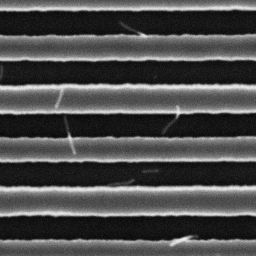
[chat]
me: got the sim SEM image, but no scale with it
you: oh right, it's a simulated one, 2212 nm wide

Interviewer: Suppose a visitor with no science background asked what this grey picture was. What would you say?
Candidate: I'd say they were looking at lines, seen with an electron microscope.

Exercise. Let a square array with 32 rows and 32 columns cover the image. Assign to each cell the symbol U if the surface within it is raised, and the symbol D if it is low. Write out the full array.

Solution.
UUUUUUUUUUUUUUUUUUUUUUUUUUUUUUUU
DDDDDDDDDDDDDDDDDDDDDDDDDDDDDDDD
DDDDDDDDDDDDDDDDDDDDDDDDDDDDDDDD
DDDDDDDDDDDDDDDDDDDDDDDDDDDDDDDD
UDDDDDUDDUUUDUUUUUUUDUUUUUUUUUUU
UUUUUUUUUUUUUUUUUUUUUUUUUUUUUUUU
UUUUUUUUUUUUUUUUUUUUUUUUUUUUUUUU
UUUUUUUUUUUUUUUUUUDUUUUUUUDDUUDU
DDDDDDDDDDDDDDDDDDDDDDDDDDDDDDDD
DDDDDDDDDDDDDDDDDDDDDDDDDDDDDDDD
DDDDDDDDDDDDDDDDDDDDDDDDDDDDDDDD
UUUUUUUUUUUUUUUUUUUUUUUUUUUUUUUU
UUUUUUUUUUUUUUUUUUUUUUUUUUUUUUUU
UUUUUUUUUUUUUUUUUUUUUUUUUUUUUUUU
DDDDDDDDDDDDDDDDDDDDDDDDDDDDDDDD
DDDDDDDDDDDDDDDDDDDDDDDDDDDDDDDD
DDDDDDDDDDDDDDDDDDDDDDDDDDDDDDDD
UUUUUUUUUUUUUUUUUUUUUUUUUUUUUUUU
UUUUUUUUUUUUUUUUUUUUUUUUUUUUUUUU
UUUUUUUUUUUUUUUUUUUUUUUUUUUUUUUU
DDDDDDDDDDDDDDDDDDDDDDDDDDDDDDDD
DDDDDDDDDDDDDDDDDDDDDDDDDDDDDDDD
DDDDDDDDDDDDDDDDDDDDDDDDDDDDDDDD
UUUUDUUUUUDUUUUUUUUDUUUUUUUUUUUU
UUUUUUUUUUUUUUUUUUUUUUUUUUUUUUUU
UUUUUUUUUUUUUUUUUUUUUUUUUUUUUUUU
UUUUUUUUUUUUUUUUUUUUUUUUUUUUUUUU
DDDDDDDDDDDDDDDDDDDDDDDDDDDDDDDD
DDDDDDDDDDDDDDDDDDDDDDDDDDDDDDDD
DDDDDDDDDDDDDDDDDDDDDDDDDDDDDDDD
UUUUUUUUUUUUUUUUUUUUUUUUUUUUUUUU
UUUUUUUUUUUUUUUUUUUUUUUUUUUUUUUU